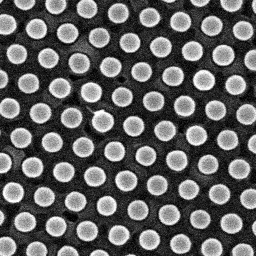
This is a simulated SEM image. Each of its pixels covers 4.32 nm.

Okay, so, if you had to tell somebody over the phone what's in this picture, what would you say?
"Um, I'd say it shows a regular array of raised bodies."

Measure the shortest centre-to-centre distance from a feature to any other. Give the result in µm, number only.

0.135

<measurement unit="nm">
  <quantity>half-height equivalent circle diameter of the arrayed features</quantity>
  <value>85.6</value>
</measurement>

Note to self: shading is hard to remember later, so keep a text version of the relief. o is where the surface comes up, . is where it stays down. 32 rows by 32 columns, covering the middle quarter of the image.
.ooooo...ooooo...oooo...........
..oooo...ooooo...ooooo...oooo...
..........ooo....ooooo...ooooo..
.................oooo....ooooo..
o........................oooo...
o....oooo.......................
o...ooooo....ooo................
o...ooooo...ooooo....ooo........
.....oooo...ooooo...ooooo....ooo
............ooooo...ooooo...oooo
..............o.....ooooo...oooo
.oo..................oo.....oooo
oooo....ooo.................oooo
oooo...ooooo....ooo.............
oooo...ooooo...ooooo....oo......
ooo.....oooo...ooooo...oooo.....
.........oo....ooooo...ooooo...o
................ooo....ooooo...o
....o...................ooo....o
...oooo........................o
..ooooo....oooo.................
..ooooo...ooooo....ooo..........
...oooo...ooooo...ooooo...oooo..
...........oooo...ooooo...ooooo.
...................ooo....ooooo.
oo........................oooo..
oo....ooo...................o...
oo...ooooo....ooo...............
oo...ooooo...ooooo....ooo.......
......oooo...ooooo...ooooo....oo
.............ooooo...ooooo...ooo
...............oo....oooo....ooo